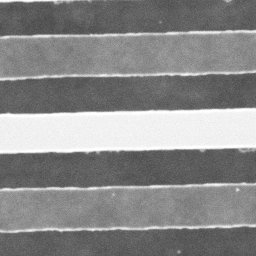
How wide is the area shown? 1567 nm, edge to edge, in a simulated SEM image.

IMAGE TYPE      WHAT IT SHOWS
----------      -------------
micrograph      lines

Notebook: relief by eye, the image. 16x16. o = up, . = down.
................
................
oooooooooooooooo
oooooooooooooooo
oooooooooooooooo
................
................
oooooooooooooooo
oooooooooooooooo
ooo.............
................
...............o
oooooooooooooooo
oooooooooooooooo
................
................